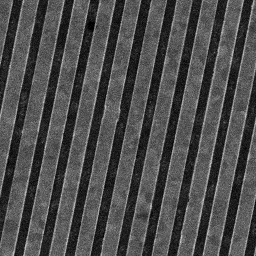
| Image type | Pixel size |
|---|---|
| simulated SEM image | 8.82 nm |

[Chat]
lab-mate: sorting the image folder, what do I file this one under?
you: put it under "parallel lines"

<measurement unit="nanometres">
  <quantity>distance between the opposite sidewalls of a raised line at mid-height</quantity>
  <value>130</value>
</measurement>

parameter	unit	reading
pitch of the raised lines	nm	222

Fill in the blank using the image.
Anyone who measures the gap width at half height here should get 86.5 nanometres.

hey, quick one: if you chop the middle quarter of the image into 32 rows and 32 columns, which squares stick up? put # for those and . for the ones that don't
###...###...####...###...####..#
###...###...####..####...####..#
###..####...####..####...###...#
###..####...###...####..####...#
##...####..####...####..####...#
##...###...####...###...####..##
##...###...####..####...####..##
##..####...####..####...###...##
##..####...###...####...###...##
#...####..####...####..####...##
#...####..####...###...####..###
#...###...####..####...####..###
#..####...####..####...###...###
#..####...####..####...###...###
...####...###...###...####...###
...####..####...###...####..####
...###...####..####...####..####
..####...####..####...###...####
..####...###...####...###...####
..####...###...###...####...###.
..####..####...###...####..####.
..###...####..####...####..####.
.####...####..####...###...####.
.####...###...####...###...####.
.####...###...###...####...###..
.####..####...###...####..####..
.###...####..####...####..####..
####...####..####...###...####..
####...###...####...###...####..
####...###...###...####...###...
####..####...###...####..####...
###...####..####...####..####...